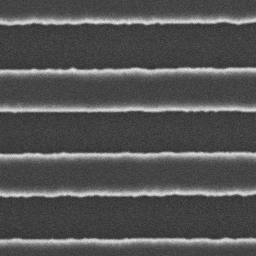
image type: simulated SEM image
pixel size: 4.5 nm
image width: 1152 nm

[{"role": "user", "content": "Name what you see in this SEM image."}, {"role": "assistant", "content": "lines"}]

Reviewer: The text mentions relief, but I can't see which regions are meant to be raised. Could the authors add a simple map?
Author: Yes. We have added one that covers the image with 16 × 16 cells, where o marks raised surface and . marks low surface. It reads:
oooooooooooooooo
................
................
................
oooooooooooooooo
oooooooooooooooo
oooooooooooooooo
................
................
................
oooooooooooooooo
oooooooooooooooo
................
................
................
oooooooooooooooo